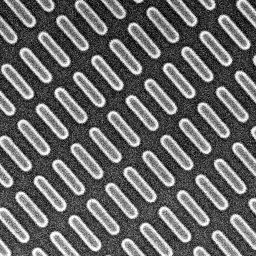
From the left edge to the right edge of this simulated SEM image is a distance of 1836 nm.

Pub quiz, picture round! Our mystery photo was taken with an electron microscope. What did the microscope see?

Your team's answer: groups of lines, slits or small figures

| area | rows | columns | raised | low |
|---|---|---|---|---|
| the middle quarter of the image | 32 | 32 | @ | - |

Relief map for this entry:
--------@@@-----@@@------@@-----
---------@@@-----@@------@@@----
---@------@@@-------------@@@---
---@@-----@@@--------------@@@--
---@@@-----@@@-------@@----@@@@-
----@@@-----@@@------@@-----@@@@
-----@@@-------------@@@-----@@@
@-----@@@-------------@@@-----@@
@@-----@@@------@@-----@@@------
@@-----@@@------@@@-----@@@-----
@@@@------------@@@@-----@@@----
-@@@-------------@@@@----@@@----
--@@@------@@-----@@@-----------
---@@------@@@-----@@@----------
----@-------@@@-----@@@------@@-
-------------@@@-----@@------@@@
@------@@----@@@@-------------@@
@------@@@----@@@@------------@@
-------@@@-----@@@@------@@-----
--------@@@-----@@@-----@@@@----
--@@-----@@@-------------@@@----
--@@@-----@@@-------------@@@---
---@@@-----@@@------@@-----@@@--
---@@@@----@@@------@@@-----@@@-
----@@@@-------------@@@----@@@@
-----@@@@------------@@@@-----@@
@-----@@@------@@@----@@@@------
@@-----@@@-----@@@-----@@@@-----
@@@-------------@@@-----@@@-----
-@@@-------------@@@-----@@-----
-@@@@------@@-----@@@-----------
--@@@------@@@----@@@@----------